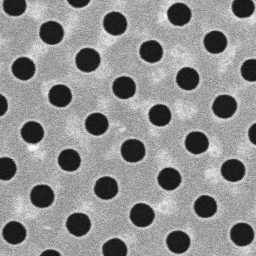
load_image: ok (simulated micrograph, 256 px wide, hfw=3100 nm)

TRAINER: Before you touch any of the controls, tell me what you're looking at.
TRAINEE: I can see a regular array of holes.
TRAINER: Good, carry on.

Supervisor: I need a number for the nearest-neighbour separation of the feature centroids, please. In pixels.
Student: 45.3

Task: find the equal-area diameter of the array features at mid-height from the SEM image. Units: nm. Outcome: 293